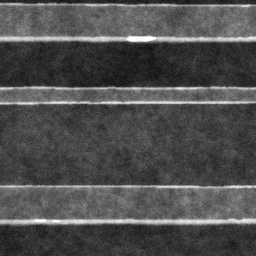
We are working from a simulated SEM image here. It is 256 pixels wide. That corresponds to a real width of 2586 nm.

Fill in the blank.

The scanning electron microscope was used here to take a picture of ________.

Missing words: lines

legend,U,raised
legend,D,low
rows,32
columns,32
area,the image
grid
DDDDDDDDDDDDDDDDDDDDDDDDDDDDDDDD
UUUUUUUUUUUUUUUUUUUUUUUUUUUUUUUU
UUUUUUUUUUUUUUUUUUUUUUUUUUUUUUUU
UUUUUUUUUUUUUUUUUUUUUUUUUUUUUUUU
UUUUUUUUUUUUUUUUUUUUUUUUUUUUUUUU
DDDDDDDDDDDDDDDDDDDDDDDDDDDDDDDD
DDDDDDDDDDDDDDDDDDDDDDDDDDDDDDDD
DDDDDDDDDDDDDDDDDDDDDDDDDDDDDDDD
DDDDDDDDDDDDDDDDDDDDDDDDDDDDDDDD
DDDDDDDDDDDDDDDDDDDDDDDDDDDDDDDD
DDDDDDDDDDDDDDDDDDDDDDDDDDDDDDDD
UUUUUUUUUUUUUUUUUUUUUUUUUUUUUUUU
UUUUUUUUUUUUUUUUUUUUUUUUUUUUUUUU
DDDDDDDDDDDDDDDDDDDDDDDDDDDDDDDD
DDDDDDDDDDDDDDDDDDDDDDDDDDDDDDDD
DDDDDDDDDDDDDDDDDDDDDDDDDDDDDDDD
DDDDDDDDDDDDDDDDDDDDDDDDDDDDDDDD
DDDDDDDDDDDDDDDDDDDDDDDDDDDDDDDD
DDDDDDDDDDDDDDDDDDDDDDDDDDDDDDDD
DDDDDDDDDDDDDDDDDDDDDDDDDDDDDDDD
DDDDDDDDDDDDDDDDDDDDDDDDDDDDDDDD
DDDDDDDDDDDDDDDDDDDDDDDDDDDDDDDD
DDDDDDDDDDDDDDDDDDDDDDDDDDDDDDDD
UUUUUUUUUUUUUUUUUUUUUUUUUUUUUUUU
UUUUUUUUUUUUUUUUUUUUUUUUUUUUUUUU
UUUUUUUUUUUUUUUUUUUUUUUUUUUUUUUU
UUUUUUUUUUUUUUUUUUUUUUUUUUUUUUUU
UUUUUUUUUUUUUUUUUUUUUUUUUUUUUUUU
DDDDDDDDDDDDDDDDDDDDDDDDDDDDDDDD
DDDDDDDDDDDDDDDDDDDDDDDDDDDDDDDD
DDDDDDDDDDDDDDDDDDDDDDDDDDDDDDDD
DDDDDDDDDDDDDDDDDDDDDDDDDDDDDDDD